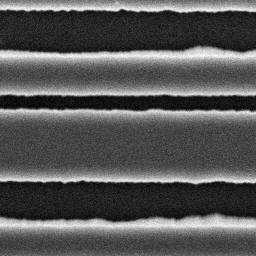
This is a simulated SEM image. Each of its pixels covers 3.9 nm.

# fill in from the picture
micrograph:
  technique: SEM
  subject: lines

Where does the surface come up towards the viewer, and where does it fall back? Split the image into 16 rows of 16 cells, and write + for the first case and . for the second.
++++++++++++++++
................
................
++++++++++++++++
++++++++++++++++
++++++++++++++++
++++++++++++++++
++++++++++++++++
++++++++++++++++
++++++++++++++++
++++++++++++++++
................
................
................
++++++++++++++++
++++++++++++++++